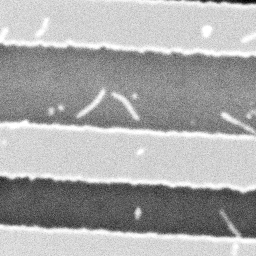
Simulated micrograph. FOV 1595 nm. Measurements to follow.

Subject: lines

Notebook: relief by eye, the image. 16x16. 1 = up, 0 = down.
1111111111111111
1111111111111111
1111111111111111
0000000000000000
0000000000000000
0000000000000000
0000000000000000
0000000000000000
1111111111111100
1111111111111111
1111111111111111
0000000000111111
0000000000000000
0000000000000000
1111111000000000
1111111111111111